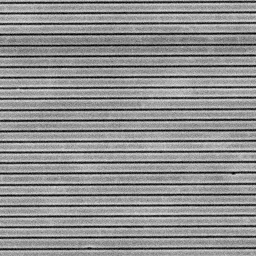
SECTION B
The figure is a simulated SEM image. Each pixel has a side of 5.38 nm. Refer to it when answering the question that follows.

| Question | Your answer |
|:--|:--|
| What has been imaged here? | parallel lines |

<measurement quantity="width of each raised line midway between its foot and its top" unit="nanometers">42.4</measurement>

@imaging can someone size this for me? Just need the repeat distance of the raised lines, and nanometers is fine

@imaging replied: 57.5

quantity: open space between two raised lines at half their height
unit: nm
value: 14.1